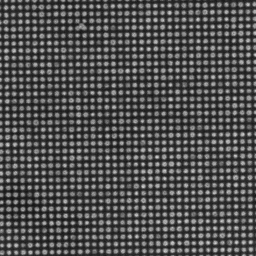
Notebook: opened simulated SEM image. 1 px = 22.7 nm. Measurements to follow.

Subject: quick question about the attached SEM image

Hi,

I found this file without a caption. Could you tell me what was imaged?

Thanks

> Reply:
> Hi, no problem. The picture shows a regular array of raised bodies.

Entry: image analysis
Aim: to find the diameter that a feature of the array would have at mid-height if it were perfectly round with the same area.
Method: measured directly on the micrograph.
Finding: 0.0887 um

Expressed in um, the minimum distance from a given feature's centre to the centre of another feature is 0.157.